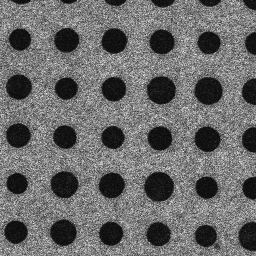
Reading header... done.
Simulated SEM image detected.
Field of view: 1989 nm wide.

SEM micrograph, a regular array of holes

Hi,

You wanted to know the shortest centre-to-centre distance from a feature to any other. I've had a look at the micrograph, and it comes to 368 nm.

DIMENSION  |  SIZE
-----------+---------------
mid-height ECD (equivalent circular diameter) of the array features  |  188 nm